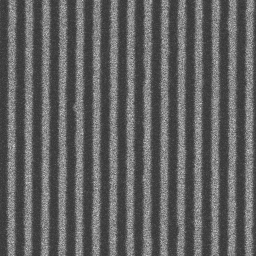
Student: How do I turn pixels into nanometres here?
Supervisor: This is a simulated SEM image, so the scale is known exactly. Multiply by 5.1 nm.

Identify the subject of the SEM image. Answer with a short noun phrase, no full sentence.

parallel lines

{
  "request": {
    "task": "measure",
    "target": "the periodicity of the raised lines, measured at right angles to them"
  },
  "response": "0.0866 micrometres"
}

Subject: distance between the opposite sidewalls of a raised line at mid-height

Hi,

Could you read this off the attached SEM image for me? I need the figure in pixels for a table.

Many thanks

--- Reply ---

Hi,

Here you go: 8.25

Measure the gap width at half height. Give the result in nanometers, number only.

46.6